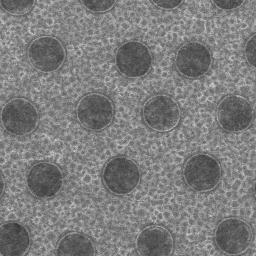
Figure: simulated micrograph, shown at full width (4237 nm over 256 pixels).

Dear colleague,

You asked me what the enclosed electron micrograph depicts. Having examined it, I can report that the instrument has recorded a regular array of raised bodies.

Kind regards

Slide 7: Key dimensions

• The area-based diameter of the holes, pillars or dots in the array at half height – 598 nm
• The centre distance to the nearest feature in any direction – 1110 nanometers